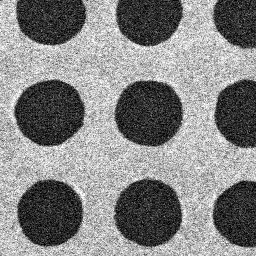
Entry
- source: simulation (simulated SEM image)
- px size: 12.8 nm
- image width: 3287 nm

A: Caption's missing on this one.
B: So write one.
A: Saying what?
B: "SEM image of holes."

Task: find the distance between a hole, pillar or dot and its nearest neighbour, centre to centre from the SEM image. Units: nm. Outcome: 1270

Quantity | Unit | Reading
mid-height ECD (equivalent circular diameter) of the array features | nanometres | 873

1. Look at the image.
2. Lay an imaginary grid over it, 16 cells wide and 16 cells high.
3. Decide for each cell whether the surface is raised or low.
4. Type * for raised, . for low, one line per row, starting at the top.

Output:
*....**....**...
*....**....**...
**..****..****..
****************
****************
**...***...***..
*....**....***..
*....**....**...
**..****...***..
****************
****************
**..****..*****.
*....**....***..
*....**....**...
*....***...***..
****************